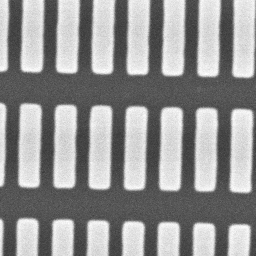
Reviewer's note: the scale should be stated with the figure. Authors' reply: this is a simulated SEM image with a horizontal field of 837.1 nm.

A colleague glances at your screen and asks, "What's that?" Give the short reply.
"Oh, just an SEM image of groups of lines, slits or small figures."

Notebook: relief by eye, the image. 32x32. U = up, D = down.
UDDUUDDUUUDDUUDDUUUDDUUDDUUDDUUU
UDDUUDDUUUDDUUDDUUUDDUUDDUUDDUUU
UDDUUDDUUUDDUUDDUUUDDUUDDUUDDUUU
UDDUUDDUUUDDUUDDUUUDUUUDDUUDDUUU
UDDUUDDUUUDDUUDDUUUDUUUDDUUDDUUU
UDDUUDDUUUDDUUDDUUDDUUUDDUUDDUUU
UDDUUDDUUUDDUUDDUUDDUUUDDUUDDUUU
UDDUUDDUUUDDUUDDUUDDUUUDDUUDDUUU
UDDUUDDUUUDDUUDDUUDDUUUDDUUDDUUU
DDDDDDDDDDDDDDDDDDDDDDDDDDDDDUUD
DDDDDDDDDDDDDDDDDDDDDDDDDDDDDDDD
DDDDDDDDDDDDDDDDDDDDDDDDDDDDDDDD
DDDDDDDDDDDDDDDDDDDDDDDDDDDDDDDD
UDDUUDDUUDDDUUDDUUDDDDDDDDDDDDDD
UDDUUDDUUDDUUUDDUUDDUUUDDUUDDUUD
UDDUUDDUUDDUUUDDUUDDUUUDDUUDDUUU
UDUUUDDUUDDUUUDDUUDDUUUDDUUDDUUD
UDUUUDDUUDDUUUDDUUDDUUUDDUUDDUUD
UDUUUDDUUDDUUUDDUUDDUUUDUUUDDUUD
UDUUUDDUUDDUUUDDUUDDUUUDUUUDDUUD
UDUUUDDUUDDUUUDDUUDDUUUDUUUDDUUD
DDUUUDDUUDDUUUDDUUDDUUUDUUUDDUUD
DDUUUDDUUDDUUUDDUUDDUUUDUUUDDUUD
DDDDDDDDDDDDUDDDUUDDUUDDDUUDDUUD
DDDDDDDDDDDDDDDDDDDDDDDDDDDDDDDD
DDDDDDDDDDDDDDDDDDDDDDDDDDDDDDDD
DDDDDDDDDDDDDDDDDDDDDDDDDDDDDDDD
DDDUDDDDDDDDDDDDDDDDDDDDDDDDDDDD
DDUUUDDUUDDUUUDUUUDDUUDDUUUDDUUD
DDUUUDDUUDDUUUDUUUDDUUDDUUUDDUUD
DDUUUDDUUDDUUDDUUUDDUUDDUUUDDUUD
DDUUUDDUUDDUUDDUUUDDUUDDUUUDDUUD